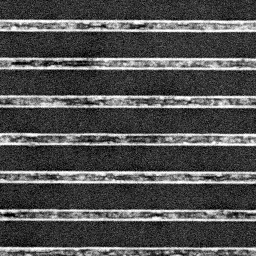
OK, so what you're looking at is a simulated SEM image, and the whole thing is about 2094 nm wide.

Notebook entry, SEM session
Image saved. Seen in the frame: parallel lines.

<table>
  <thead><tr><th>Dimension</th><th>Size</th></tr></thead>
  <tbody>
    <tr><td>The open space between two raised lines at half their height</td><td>232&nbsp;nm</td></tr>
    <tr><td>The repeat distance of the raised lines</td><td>310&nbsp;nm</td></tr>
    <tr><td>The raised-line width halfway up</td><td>81.8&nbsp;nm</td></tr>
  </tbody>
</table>